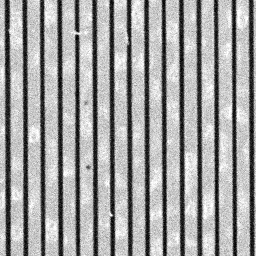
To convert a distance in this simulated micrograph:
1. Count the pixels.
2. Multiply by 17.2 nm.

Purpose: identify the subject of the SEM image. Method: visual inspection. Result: parallel lines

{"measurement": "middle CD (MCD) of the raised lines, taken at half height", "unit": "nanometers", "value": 219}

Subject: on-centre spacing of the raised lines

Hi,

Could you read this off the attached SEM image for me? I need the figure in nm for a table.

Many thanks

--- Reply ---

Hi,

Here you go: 298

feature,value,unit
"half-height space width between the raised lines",87.9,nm